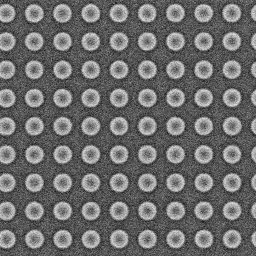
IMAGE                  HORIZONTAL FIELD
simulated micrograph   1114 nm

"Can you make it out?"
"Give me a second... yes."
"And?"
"an array of small figures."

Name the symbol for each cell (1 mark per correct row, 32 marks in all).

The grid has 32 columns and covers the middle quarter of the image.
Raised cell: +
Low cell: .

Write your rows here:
++...++++...++++...++++...++++..
++...++++...++++...++++...++++..
+....++++...++++...++++...++++..
......+......++.....++.....++...
................................
................................
......+......++.....++.....++...
+....++++...++++...++++...++++..
++...++++...++++...++++...++++..
++...++++...++++...++++...++++..
+.....++.....++.....++.....++...
................................
................................
......+......+......++.....++...
++...++++...++++...++++...++++..
++...++++...++++...++++...++++..
++...++++...++++...++++...++++..
+.....++.....++.....++.....++...
................................
................................
......+....................+....
++...++++...++++...++++...++++..
++...++++...++++...++++...++++..
++...++++...++++...++++...++++..
+....+++.....++.....++.....++...
................................
................................
................................
++...++++...++++...++++...++++..
++...++++...++++...++++...++++..
++...++++...++++...++++...++++..
+....+++....+++.....++.....++...